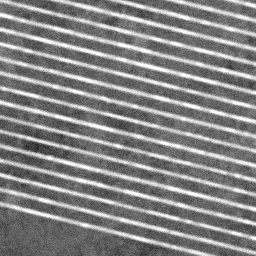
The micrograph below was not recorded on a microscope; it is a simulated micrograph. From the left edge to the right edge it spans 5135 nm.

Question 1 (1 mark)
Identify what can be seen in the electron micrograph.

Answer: parallel lines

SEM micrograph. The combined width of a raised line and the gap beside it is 0.283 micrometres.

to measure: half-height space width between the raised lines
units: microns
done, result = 0.229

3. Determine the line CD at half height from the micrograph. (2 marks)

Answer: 0.0511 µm